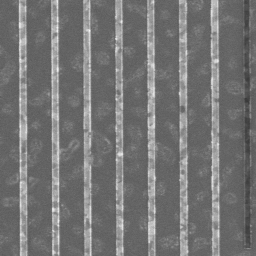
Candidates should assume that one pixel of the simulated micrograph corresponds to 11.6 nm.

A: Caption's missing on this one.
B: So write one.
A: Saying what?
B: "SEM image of parallel lines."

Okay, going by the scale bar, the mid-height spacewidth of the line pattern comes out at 302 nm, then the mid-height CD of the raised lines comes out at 6.12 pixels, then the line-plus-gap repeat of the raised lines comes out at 370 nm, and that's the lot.